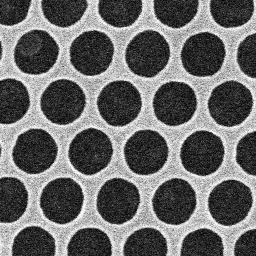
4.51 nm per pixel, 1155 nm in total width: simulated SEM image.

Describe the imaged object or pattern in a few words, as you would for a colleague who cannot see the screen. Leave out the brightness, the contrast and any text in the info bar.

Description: a regular array of holes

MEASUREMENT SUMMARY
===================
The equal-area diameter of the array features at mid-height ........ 45.3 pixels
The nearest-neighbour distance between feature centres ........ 0.251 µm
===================